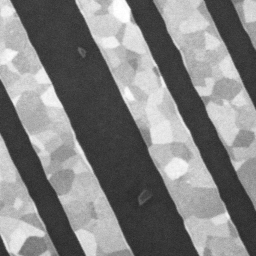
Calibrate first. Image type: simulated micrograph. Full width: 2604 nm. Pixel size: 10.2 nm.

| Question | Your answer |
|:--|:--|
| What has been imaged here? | groups of lines, slits or small figures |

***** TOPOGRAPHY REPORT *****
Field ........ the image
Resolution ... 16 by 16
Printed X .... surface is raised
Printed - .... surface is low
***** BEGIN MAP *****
X----XXX--XXX--X
X----XXXX-XXX--X
XX----XXX--XXX--
XX----XXX--XXX--
XXX----XXX--XXX-
XXX----XXX--XXX-
-XXX----XXX--XXX
-XXX----XXX--XXX
--XXX----XXX--XX
--XXX----XXX--XX
X--XXX----XXX--X
X--XXX----XXX--X
XX--XXX----XXX--
XX--XXX----XXX--
XXX--XXX----XXX-
XXX--XXX----XXX-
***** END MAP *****